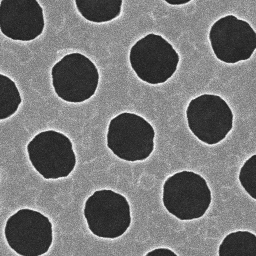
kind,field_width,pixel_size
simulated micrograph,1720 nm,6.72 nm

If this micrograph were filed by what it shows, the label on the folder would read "holes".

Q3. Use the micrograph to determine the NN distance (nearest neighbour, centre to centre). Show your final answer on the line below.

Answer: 538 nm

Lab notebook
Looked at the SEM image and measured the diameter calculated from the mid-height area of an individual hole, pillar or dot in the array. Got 47.9 pixels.